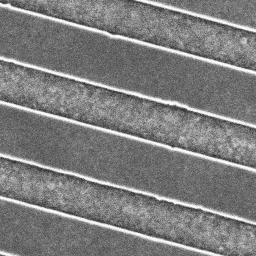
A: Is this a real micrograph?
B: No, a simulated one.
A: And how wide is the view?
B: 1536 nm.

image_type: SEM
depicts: one or a few lines or trenches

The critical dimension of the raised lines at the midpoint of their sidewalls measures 51.5 px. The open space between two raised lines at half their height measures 245 nm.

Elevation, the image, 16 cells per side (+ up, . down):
+..........+++++
++++..........++
++++++++........
++++++++++++....
...+++++++++++++
.......+++++++++
+..........+++++
++++..........++
++++++++........
++++++++++++....
...++++++++++++.
.......+++++++++
+.........++++++
++++..........++
++++++++........
++++++++++++....